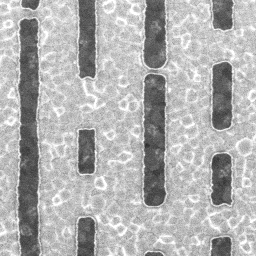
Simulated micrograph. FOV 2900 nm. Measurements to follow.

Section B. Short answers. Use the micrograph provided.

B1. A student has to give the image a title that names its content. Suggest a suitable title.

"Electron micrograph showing one or a few lines or trenches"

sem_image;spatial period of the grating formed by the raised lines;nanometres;716